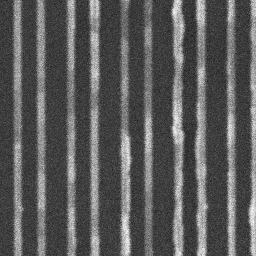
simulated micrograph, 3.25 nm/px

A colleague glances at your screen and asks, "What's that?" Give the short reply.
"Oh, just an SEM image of parallel lines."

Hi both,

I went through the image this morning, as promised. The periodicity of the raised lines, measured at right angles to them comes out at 26.7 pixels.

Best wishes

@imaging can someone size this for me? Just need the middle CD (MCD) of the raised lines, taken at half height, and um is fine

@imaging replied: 0.0199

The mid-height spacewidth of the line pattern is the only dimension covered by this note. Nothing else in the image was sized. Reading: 60.1 nanometres